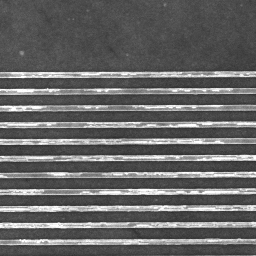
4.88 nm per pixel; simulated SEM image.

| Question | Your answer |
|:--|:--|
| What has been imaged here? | parallel lines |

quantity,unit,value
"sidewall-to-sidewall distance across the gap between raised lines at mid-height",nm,54.3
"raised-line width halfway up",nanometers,26.8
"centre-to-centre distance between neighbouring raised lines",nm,81.6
